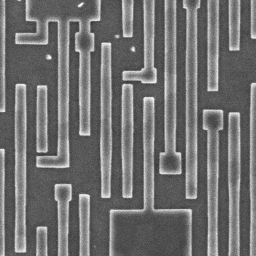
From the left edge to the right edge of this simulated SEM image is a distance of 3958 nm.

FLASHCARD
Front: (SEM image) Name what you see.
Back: wiring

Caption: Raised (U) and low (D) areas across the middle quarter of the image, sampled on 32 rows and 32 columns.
UDDDUUDDDUUUDDDDDDDDUUDDDUUUDDDU
UDDDUUDDDUUUDDDDDDDUUUUDDUUUDDDU
UDDDUUDDDUUUDDDUUUUUUUUDDUUUDDDU
UDDDUUDDDUUUDDDUUUUUUUUDDUUUDDDU
UDDDUUDDDUUUDDDDDDDDUUUDDUUUDDDU
UDDDUUDDDUUUDDDUUDDDDDDDDUUUDDDU
UDDDUUDDDUUUDDDUUDDDDDDDDUUUDDDU
UDDDUUDDDUUUDDDUUDDDDDDDDUUUDDDU
UDDDUUDDDUUUDDDUUDDDUUDDDUUUDDDU
UDDDUUDDDUUUDDDUUDDDUUDDDUUUDDDU
UDDDUUDDDUUUDDDUUDDDUUDDDUUUDDDU
UDDDUUDDDUUUDDDUUDDDUUDDDUUUDDDU
UDDDUUDDDUUUDDDUUDDDUUDDDUUUDDDU
UDDDUUDDDUUUDDDUUDDDUUDDDUUUDDDU
UDDDUUDDDUUUDDDUUDDDUUDDDUUUDDDU
UDDDUUDDDUUUDDDUUDDDUUDDDUUUDDDU
UDDDUUDDDUUUDDDUUDDDUUDDDUUUDDDU
UDDDUUDDDUUUDDDUUDDDUUDDDUUUDDDU
UDDDDDDDDUUUDDDUUDDDUUDDDUUUDDDU
UDDDDDDDDUUUDDDUUDDDUUDDDUUUDDDU
UDDDDDDDDUUUDDDUUDDDUUDDDUUUDDDU
UDDDDDDDDUUUDDDUUDDDUUDDDUUUDDDU
UDDDDDDDDUUUDDDUUDDDUUDDUUUUUDDU
UDDDDDDDDUUUDDDUUDDDUUDDUUUUUDDU
UDDDDDDDDUUUDDDUUDDDUUDDUUUUUDDU
UDDDDDDDDUUUDDDUUDDDUUDDUUUUUDDU
DDDDDDDDDUUUDDDUUDDDUUDDUUUUUDDU
DDDDDDDDDDUUDDDUUDDDUUDDDDDDDDDU
DDDDDDDDDDUUDDDUUDDDUUDDDDDDDDDU
DDDDDDDDDDUDDDDUUDDDUUDDDDDDDDDU
UUDDDDDDDDUDDDDUUDDDUUDDDDDDDDDU
UUDDDDDDDDUDDDDUUDDDUUDDDDDDDDDU